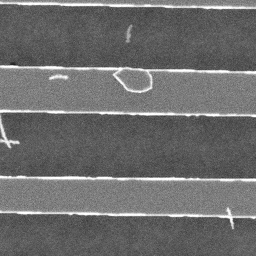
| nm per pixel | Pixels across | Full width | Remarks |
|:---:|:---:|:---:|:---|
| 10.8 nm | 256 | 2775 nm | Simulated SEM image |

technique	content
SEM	lines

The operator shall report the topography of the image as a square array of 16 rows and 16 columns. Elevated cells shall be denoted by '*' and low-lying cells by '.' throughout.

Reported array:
................
................
................
................
***************.
****************
****************
................
................
................
................
****************
****************
.............***
................
................